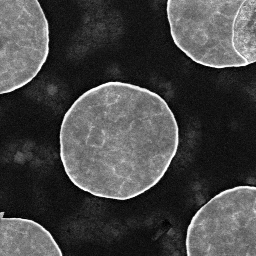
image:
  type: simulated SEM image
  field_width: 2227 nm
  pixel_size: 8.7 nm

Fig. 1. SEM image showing raised bodies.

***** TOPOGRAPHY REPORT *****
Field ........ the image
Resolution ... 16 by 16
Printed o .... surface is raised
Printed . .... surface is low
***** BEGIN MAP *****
ooo.......ooooo.
ooo........oooo.
ooo........oooo.
ooo.........ooo.
oo..............
o.....ooo.......
.....ooooo......
....ooooooo.....
....ooooooo.....
....ooooooo.....
....oooooo......
.....ooooo......
.............ooo
............oooo
ooo.........oooo
oooo........oooo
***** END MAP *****